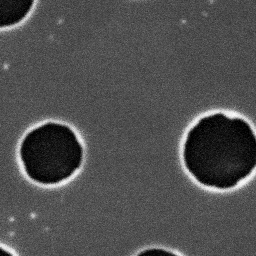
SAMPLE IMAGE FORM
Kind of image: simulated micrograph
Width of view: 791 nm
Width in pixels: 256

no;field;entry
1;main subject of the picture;holes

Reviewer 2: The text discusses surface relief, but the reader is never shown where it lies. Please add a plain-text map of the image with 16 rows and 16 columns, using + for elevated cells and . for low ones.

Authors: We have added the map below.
..++++++++++++++
.+++++++++++++++
++++++++++++++++
++++++++++++++++
++++++++++++++++
++++++++++++++++
++++++++++++++++
+++++++++++++..+
++...+++++++....
+....+++++++....
++...+++++++....
+++++++++++++..+
++++++++++++++++
++++++++++++++++
++++++++++++++++
++++++++++++++++